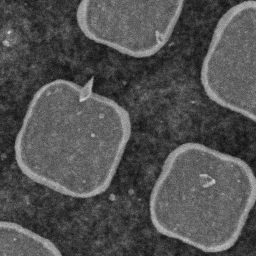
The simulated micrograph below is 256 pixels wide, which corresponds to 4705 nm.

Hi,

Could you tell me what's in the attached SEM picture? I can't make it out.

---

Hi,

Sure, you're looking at raised bodies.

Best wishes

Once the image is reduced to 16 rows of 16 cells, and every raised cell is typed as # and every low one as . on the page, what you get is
.....######....#
.....######...##
......####...###
.............###
.............###
...##........###
..#####.......##
..######........
.#######........
.#######...##...
.######...#####.
...####...######
.........#######
..........#####.
##........#####.
###..........#..